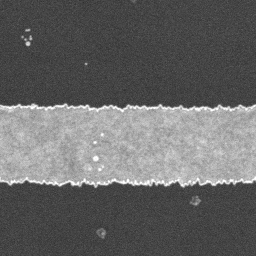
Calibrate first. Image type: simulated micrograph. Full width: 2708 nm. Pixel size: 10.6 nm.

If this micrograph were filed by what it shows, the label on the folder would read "one or a few lines or trenches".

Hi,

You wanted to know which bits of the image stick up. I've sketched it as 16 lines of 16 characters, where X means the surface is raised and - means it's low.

XXXXXXXXXXXXXXXX
XXXXXXXXXXXXXXXX
XXXXXXXXXXXXXXXX
XXXXXXXXXXXXXXXX
XXXXXXXXXXXXXXXX
XXXXXXXXXXXXXXXX
XXXXXXXXXXXXXXXX
X---------------
--X-------------
----------------
------X---------
XXXXXXXXXXXXXXXX
XXXXXXXXXXXXXXXX
XXXXXXXXXXXXXXXX
XXXXXXXXXXXXXXXX
XXXXXXXXXXXXXXXX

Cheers